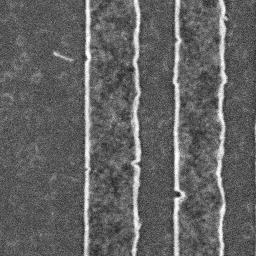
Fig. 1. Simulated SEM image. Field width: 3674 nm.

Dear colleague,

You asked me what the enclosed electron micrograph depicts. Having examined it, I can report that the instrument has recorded one or a few lines or trenches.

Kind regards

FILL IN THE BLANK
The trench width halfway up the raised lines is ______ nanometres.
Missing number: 563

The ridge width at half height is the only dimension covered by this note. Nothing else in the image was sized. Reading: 691 nm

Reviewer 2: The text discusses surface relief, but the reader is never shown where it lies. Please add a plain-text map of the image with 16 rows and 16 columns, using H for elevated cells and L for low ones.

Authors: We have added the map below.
LLLLLLHHHLLHHHLL
LLLLLLHHHLLHHHLL
LLLLLLHHHLLHHHLL
LLLLLLHHHLLHHHLL
LLLLLHHHHLLHHHLL
LLLLLHHHHLLHHHLL
LLLLLHHHLLLHHHLL
LLLLLHHHLLLHHHLL
LLLLLHHHHLLHHHLL
LLLLLHHHHLLHHHLL
LLLLLHHHHLLHHHLL
LLLLLHHHHLLHHHLL
LLLLLHHHLLLHHHLL
LLLLLHHHLLLHHHLL
LLLLLHHHHLLHHHLL
LLLLLHHHLLLHHHLL